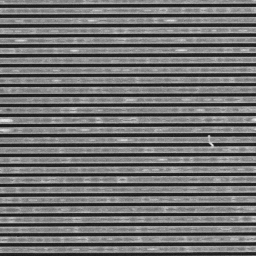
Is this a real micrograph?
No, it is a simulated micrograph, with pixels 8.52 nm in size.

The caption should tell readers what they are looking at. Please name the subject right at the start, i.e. parallel lines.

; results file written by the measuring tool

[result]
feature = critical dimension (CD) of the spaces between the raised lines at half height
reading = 0.0288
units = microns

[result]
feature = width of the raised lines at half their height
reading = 51.1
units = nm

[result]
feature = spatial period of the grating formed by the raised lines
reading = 0.0847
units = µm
